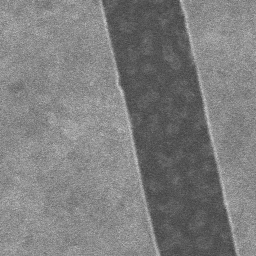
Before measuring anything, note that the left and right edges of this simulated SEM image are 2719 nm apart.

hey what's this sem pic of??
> one or a few lines or trenches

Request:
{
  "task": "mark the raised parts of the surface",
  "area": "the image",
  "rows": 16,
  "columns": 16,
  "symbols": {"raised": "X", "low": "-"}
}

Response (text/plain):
XXXXXX-----XXXXX
XXXXXXX-----XXXX
XXXXXXX-----XXXX
XXXXXXX-----XXXX
XXXXXXX-----XXXX
XXXXXXX------XXX
XXXXXXXX-----XXX
XXXXXXXX-----XXX
XXXXXXXX-----XXX
XXXXXXXX-----XXX
XXXXXXXXX-----XX
XXXXXXXXX-----XX
XXXXXXXXX-----XX
XXXXXXXXX-----XX
XXXXXXXXX------X
XXXXXXXXXX-----X